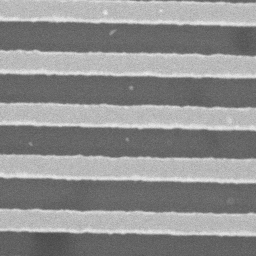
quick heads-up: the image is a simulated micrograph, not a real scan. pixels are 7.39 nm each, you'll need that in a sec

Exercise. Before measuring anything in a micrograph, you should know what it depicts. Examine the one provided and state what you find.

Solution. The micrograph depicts lines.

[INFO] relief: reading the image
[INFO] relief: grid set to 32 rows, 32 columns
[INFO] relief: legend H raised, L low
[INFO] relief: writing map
HHHHHHHHHHHHHHHHHHHHHHHHHHHHHHHH
HHHHHHHHHHHHHHHHHHHHHHHHHHHHHHHH
HHHHHHHHHHHHHHHHHHHHHHHHHHHHHHHH
LLLLLLLLLLLLLLLLLLLLLLLLLLLLLLLL
LLLLLLLLLLLLLLLLLLLLLLLLLLLLLLLL
LLLLLLLLLLLLLLLLLLLLLLLLLLLLLLLL
HHHHHLLLLLLLLLLLLLLLLLLLLLLLLLLL
HHHHHHHHHHHHHHHHHHHHHHHHHHHHHHHH
HHHHHHHHHHHHHHHHHHHHHHHHHHHHHHHH
LLLLLLLLLLLLLLLLLLLHHHHHHHHHHHHH
LLLLLLLLLLLLLLLLLLLLLLLLLLLLLLLL
LLLLLLLLLLLLLLLLLLLLLLLLLLLLLLLL
LLLLLLLLLLLLLLLLLLLLLLLLLLLLLLLL
HHHHHHHHHHHHHHHHHHHHHHHHHHHHLLLL
HHHHHHHHHHHHHHHHHHHHHHHHHHHHHHHH
HHHHHHHHHHHHHHHHHHHHHHHHHHHHHHHH
LLLLLLLLLLLLLLLLLLLLLLLLLLLLLLLL
LLLLLLLLLLLLLLLLLLLLLLLLLLLLLLLL
LLLLLLLLLLLLLLLLLLLLLLLLLLLLLLLL
HHHHHHHLLHLLLLLLLLLLLLLLLLLLLLLL
HHHHHHHHHHHHHHHHHHHHHHHHHHHHHHHH
HHHHHHHHHHHHHHHHHHHHHHHHHHHHHHHH
LLLLLLLLLLLLLLLLLLHHHHHHHHHHHHHH
LLLLLLLLLLLLLLLLLLLLLLLLLLLLLLLL
LLLLLLLLLLLLLLLLLLLLLLLLLLLLLLLL
LLLLLLLLLLLLLLLLLLLLLLLLLLLLLLLL
HHHHHHHHHHHHHHHHHHLLLLLLLLLLLLLL
HHHHHHHHHHHHHHHHHHHHHHHHHHHHHHHH
HHHHHHHHHHHHHHHHHHHHHHHHHHHHHHHH
LLLLLLLLLLLLLLLLLLLLLLLLLLLLLLLL
LLLLLLLLLLLLLLLLLLLLLLLLLLLLLLLL
LLLLLLLLLLLLLLLLLLLLLLLLLLLLLLLL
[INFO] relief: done